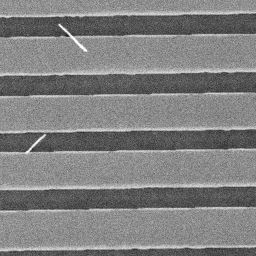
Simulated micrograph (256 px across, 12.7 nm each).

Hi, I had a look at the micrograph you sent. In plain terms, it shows lines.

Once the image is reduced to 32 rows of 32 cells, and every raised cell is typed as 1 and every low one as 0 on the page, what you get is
11111111111111111111111111111111
11111111111111111111111111111111
00000000000000000000000000000000
00000000000000000000000000000000
00000000000000000011111111111111
11111111111111111111111111111111
11111111111111111111111111111111
11111111111111111111111111111111
11111111111111111111111111111111
00000000000000000000000000000000
00000000000000000000000000000000
00000000000000000000000000000000
11111111111111111111111111111111
11111111111111111111111111111111
11111111111111111111111111111111
11111111111111111111111111111111
11100000000000000000000000000000
00000000000000000000000000000000
00000000000000000000000000000000
11111111111111111111111111111111
11111111111111111111111111111111
11111111111111111111111111111111
11111111111111111111111111111111
11111111000000000000000000000000
00000000000000000000000000000000
00000000000000000000000000000000
11111111111111111111111111111111
11111111111111111111111111111111
11111111111111111111111111111111
11111111111111111111111111111111
11111111111111111111111111111111
00000000000000000000000000000000